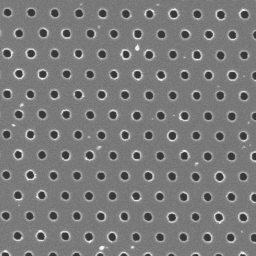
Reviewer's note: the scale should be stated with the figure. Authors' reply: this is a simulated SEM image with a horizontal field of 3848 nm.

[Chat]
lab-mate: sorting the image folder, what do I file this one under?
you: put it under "a regular array of holes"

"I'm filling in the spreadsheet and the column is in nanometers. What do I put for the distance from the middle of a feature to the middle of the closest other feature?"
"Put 347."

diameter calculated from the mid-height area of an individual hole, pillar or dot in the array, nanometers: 120